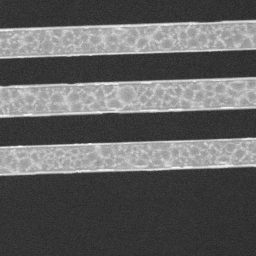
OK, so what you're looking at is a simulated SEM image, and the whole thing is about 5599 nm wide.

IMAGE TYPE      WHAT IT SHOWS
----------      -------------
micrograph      parallel lines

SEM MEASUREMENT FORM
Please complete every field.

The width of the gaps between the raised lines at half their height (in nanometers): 645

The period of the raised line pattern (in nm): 1280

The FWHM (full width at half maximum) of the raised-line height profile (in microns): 0.604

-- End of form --